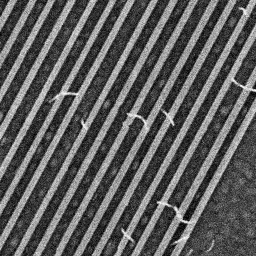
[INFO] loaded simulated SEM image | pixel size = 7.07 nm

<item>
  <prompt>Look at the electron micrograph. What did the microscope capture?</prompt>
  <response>parallel lines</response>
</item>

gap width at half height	11.5	pixels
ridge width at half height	38.1	nm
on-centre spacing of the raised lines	124	nanometres